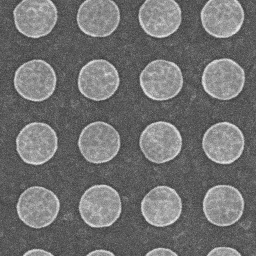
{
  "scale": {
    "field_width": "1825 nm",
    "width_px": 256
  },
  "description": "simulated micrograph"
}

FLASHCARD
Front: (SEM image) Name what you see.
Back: a regular array of raised bodies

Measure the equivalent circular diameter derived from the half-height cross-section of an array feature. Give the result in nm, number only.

288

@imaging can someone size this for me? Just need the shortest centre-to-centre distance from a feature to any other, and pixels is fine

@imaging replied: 62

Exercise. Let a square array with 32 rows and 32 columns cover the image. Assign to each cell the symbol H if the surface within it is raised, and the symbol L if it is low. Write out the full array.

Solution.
LLHHHHHLLLHHHHLLLLHHHHLLLLHHHHLL
LLHHHHHLLLHHHHHLLHHHHHLLLHHHHHLL
LLHHHHHLLLHHHHHLLLHHHHHLLHHHHHLL
LLHHHHHLLLHHHHLLLLHHHHLLLLHHHHLL
LLLHHLLLLLLLHLLLLLLHHLLLLLLHHLLL
LLLLLLLLLLLLLLLLLLLLLLLLLLLLLLLL
LLLLLLLLLLLLLLLLLLLLLLLLLLLLLLLL
LLLLLLLLLLLLLLLLLLLLLLLLLLLHHLLL
LLLHHHLLLLHHHHLLLLHHHHLLLLHHHHLL
LLHHHHHLLLHHHHHLLLHHHHHLLHHHHHLL
LLHHHHHLLLHHHHHLLLHHHHHLLHHHHHLL
LLHHHHHLLLHHHHLLLLHHHHLLLLHHHHLL
LLLLHLLLLLLLLLLLLLLLLLLLLLLLLLLL
LLLLLLLLLLLLLLLLLLLLLLLLLLLLLLLL
LLLLLLLLLLLLLLLLLLLLLLLLLLLLLLLL
LLLLHLLLLLLHHLLLLLLHHLLLLLLHHLLL
LLLHHHHLLLHHHHHLLLHHHHLLLLHHHHLL
LLHHHHHLLLHHHHHLLLHHHHHLLHHHHHLL
LLHHHHHLLLHHHHHLLLHHHHHLLHHHHHLL
LLLHHHLLLLHHHHLLLLHHHHLLLLHHHHLL
LLLLLLLLLLLLLLLLLLLLLLLLLLLLLLLL
LLLLLLLLLLLLLLLLLLLLLLLLLLLLLLLL
LLLLLLLLLLLLLLLLLLLLLLLLLLLLLLLL
LLLLHLLLLLLHHHLLLLLHHLLLLLLHHLLL
LLLHHHHLLLHHHHHLLLHHHHLLLLHHHHLL
LLHHHHHLLLHHHHHLLLHHHHHLLLHHHHLL
LLHHHHHLLLHHHHHLLLHHHHHLLLHHHHLL
LLLHHHHLLLLHHHLLLLHHHHLLLLHHHHLL
LLLLLLLLLLLLLLLLLLLLLLLLLLLLLLLL
LLLLLLLLLLLLLLLLLLLLLLLLLLLLLLLL
LLLLLLLLLLLLLLLLLLLLLLLLLLLLLLLL
LLLLHHLLLLLLHLLLLLLHHHLLLLHHHHLL